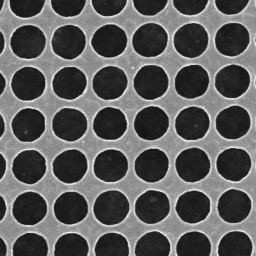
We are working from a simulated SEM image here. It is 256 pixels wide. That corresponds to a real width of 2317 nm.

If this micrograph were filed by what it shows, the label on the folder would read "a regular array of holes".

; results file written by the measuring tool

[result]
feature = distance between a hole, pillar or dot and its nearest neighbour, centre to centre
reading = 40.8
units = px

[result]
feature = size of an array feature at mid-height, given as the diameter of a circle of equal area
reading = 311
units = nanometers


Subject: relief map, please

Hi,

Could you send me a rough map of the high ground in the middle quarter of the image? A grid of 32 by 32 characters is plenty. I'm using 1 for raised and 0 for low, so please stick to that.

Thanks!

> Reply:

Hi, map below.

11111111111111111111000111111110
00001111100000111110000001111000
00000111000000011100000000110000
00000010000000001000000000110000
00000010000000001000000000110000
00000010000000001100000000110000
00000110000000011100000000110000
00001111000000011100000001111000
00011111100000111111000111111100
11111111111111111111111111111111
11111111111111111111110111111111
00001111100000111110000001111100
00000111000000011100000000111000
00000011000000001100000000110000
00000010000000001100000000110000
00000010000000001000000000110000
00000110000000001100000000110000
00000111000000011100000001110000
00001111100000111110000011111100
11111111111111111111111111111111
11111111111111111111111111111111
10011111110001111111100011111100
00000111100000011110000000111000
00000011000000001100000000110000
00000011000000001100000000110000
00000010000000001100000000110000
00000010000000001100000000110000
00000111000000011100000000111000
00001111000000011110000001111000
00011111111001111111100111111110
11111111111111111111111111111111
11111111111001111111111111111111